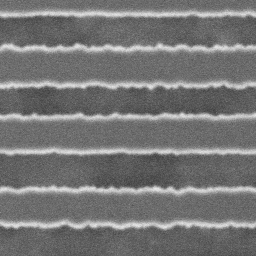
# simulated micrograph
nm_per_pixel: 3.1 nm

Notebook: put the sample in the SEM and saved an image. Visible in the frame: lines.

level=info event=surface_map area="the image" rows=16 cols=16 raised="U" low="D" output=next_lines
UUUUUUUUUUUUUUUU
DDDDDDDDDDDDDDDD
DDDDDDDDDDDDDDDD
UUUUUUUUUUUUUUUU
UUUUUUUUUUUUUUUU
DDDDDDDDDDDDDDDD
DDDDDDDDDDDDDDDD
UUUUUUUUUUUUUUUU
UUUUUUUUUUUUUUUU
UUUUUUUUUUUUUUUU
DDDDDDDDDDDDDDDD
DDDDDDDDDDDDDDDD
UUUUUUUUUUUUUUUU
UUUUUUUUUUUUUUUU
DDDDDDDDDDDDDDDD
DDDDDDDDDDDDDDDD